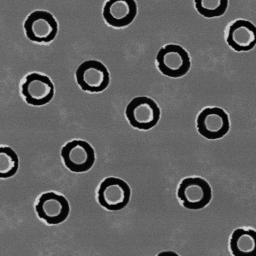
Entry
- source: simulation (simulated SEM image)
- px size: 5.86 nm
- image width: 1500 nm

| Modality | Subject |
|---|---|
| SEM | a regular array of ring-shaped grooves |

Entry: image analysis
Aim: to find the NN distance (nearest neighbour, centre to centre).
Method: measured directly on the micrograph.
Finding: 0.346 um